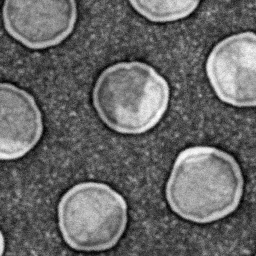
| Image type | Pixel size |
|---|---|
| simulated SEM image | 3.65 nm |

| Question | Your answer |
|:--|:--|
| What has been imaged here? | raised bodies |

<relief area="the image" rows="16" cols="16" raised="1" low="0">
1111100001110000
1111100000000000
0111000000000011
0000000000000111
0000000111000111
1000001111000011
1100001111000001
1100000111000000
1100000000000000
1100000000001100
0000000000011110
0000000000011110
0000111100011110
0000111100001100
0000111100000000
0000010000000000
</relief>